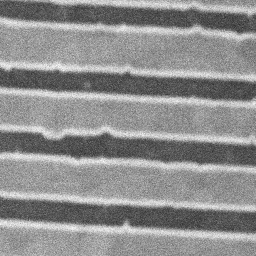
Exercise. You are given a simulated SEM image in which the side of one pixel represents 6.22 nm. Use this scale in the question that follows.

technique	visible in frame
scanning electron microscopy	one or a few lines or trenches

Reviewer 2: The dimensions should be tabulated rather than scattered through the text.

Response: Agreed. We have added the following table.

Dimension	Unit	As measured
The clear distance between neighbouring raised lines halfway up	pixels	27.1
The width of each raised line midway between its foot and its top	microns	0.241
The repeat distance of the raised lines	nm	411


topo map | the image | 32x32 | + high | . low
...................+++++++++++++
................................
................................
+++++++++++.+...................
+++++++++++++++++++++++++++++...
++++++++++++++++++++++++++++++++
++++++++++++++++++++++++++++++++
++++++++++++++++++++++++++++++++
.........+++++++++++++++++++++++
.............................+++
................................
+...............................
+++++++++++++++++++.+...........
++++++++++++++++++++++++++++++++
++++++++++++++++++++++++++++++++
++++++++++++++++++++++++++++++++
.....+++.+++..++++++++++++++++++
.............................+++
................................
.+..............................
+++++++++++++++++++.............
++++++++++++++++++++++++++++++++
++++++++++++++++++++++++++++++++
++++++++++++++++++++++++++++++++
...+.+++++++++++++++++++++++++++
......................++++++++++
................................
................................
++++++++.......+................
++++++++++++++++++++++++++++....
++++++++++++++++++++++++++++++++
++++++++++++++++++++++++++++++++